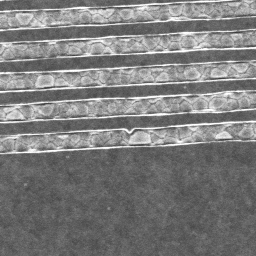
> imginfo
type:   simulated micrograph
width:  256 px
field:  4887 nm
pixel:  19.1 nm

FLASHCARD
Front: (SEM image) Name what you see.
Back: parallel lines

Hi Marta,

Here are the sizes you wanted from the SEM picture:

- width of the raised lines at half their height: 257 nm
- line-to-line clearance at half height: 343 nm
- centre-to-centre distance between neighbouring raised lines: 589 nm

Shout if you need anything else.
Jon